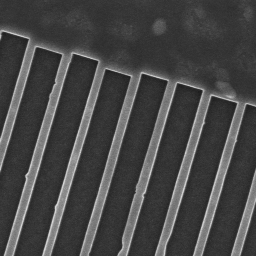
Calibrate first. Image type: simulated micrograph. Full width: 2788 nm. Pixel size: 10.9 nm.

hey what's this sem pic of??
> parallel lines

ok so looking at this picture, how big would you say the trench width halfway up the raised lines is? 302 nanometres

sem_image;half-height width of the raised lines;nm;88.8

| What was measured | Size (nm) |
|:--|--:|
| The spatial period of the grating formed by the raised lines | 395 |